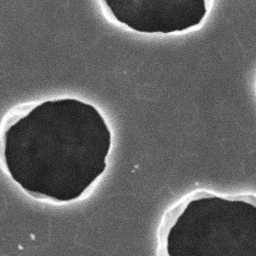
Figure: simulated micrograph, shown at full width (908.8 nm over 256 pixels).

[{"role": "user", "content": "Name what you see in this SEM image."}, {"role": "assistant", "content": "holes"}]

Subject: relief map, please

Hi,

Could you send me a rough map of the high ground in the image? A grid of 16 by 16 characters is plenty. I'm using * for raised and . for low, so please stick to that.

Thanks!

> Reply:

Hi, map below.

*******......***
********....****
****************
****************
****************
****************
**...***********
*......*********
.......*********
.......*********
......**********
*.....**********
***..*******....
***********.....
***********.....
**********......